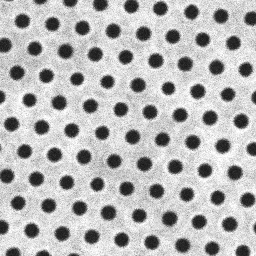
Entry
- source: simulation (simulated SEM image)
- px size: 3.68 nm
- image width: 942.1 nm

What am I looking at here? a regular array of holes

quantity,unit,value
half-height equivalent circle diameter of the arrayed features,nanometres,52.5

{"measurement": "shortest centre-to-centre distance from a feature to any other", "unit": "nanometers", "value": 108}